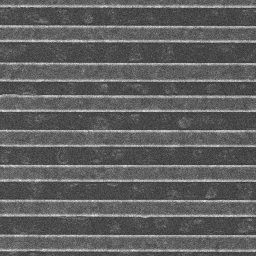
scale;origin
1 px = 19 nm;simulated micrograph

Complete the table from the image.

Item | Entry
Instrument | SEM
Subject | parallel lines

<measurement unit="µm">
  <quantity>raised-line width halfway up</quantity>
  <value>0.29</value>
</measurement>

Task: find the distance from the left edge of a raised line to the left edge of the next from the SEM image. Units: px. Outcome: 34.9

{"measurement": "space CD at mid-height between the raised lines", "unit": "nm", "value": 380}